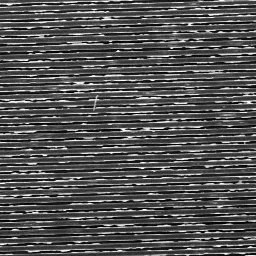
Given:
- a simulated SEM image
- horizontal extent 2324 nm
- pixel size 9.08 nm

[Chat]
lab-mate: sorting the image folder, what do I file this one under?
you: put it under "parallel lines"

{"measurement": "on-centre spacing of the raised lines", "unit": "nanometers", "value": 72.6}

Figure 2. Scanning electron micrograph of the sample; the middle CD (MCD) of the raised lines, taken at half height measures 55.6 nm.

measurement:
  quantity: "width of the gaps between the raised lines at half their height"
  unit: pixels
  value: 2.38